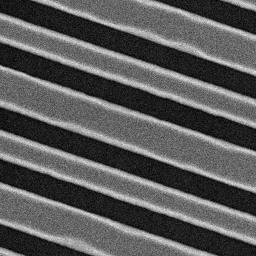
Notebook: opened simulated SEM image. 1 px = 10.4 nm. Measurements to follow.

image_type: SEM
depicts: lines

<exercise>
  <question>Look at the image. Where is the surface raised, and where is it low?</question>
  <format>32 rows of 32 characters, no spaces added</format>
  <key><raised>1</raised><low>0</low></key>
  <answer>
00000011111111111111000000000111
00000000111111111111111000000000
11100000000111111111111111000000
11111000000000111111111111111000
11111111000000000111111111111111
01111111111000000000111111111111
00001111111111000000000111111111
00000001111111111000000000111111
10000000001111111111000000000111
11110000000001111111111000000000
11111110000000001111111111000000
11111111110000000001111111111000
11111111111110000000001111111111
01111111111111110000000001111111
00001111111111111110000000011111
00000011111111111111110000000001
10000000001111111111111110000000
11110000000001111111111111100000
11111110000000011111111111111110
11111111100000000011111111111111
00111111111110000000011111111111
00000111111111100000000011111111
00000000111111111100000000011111
11000000000111111111100000000011
11111000000000111111111100000000
11111111000000000111111111100000
11111111111000000000111111111100
11111111111111000000000111111111
00111111111111110000000000111111
00000111111111111111000000000111
00000000111111111111111000000000
11000000000111111111111111000000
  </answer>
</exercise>